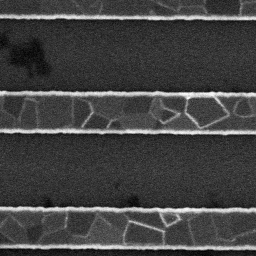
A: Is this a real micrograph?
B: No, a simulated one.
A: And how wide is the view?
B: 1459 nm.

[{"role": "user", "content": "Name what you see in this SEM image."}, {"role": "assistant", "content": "lines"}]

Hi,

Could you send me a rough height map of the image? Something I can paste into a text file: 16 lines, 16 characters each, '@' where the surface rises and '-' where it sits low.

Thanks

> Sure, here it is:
@@@@@@@@@@@@@@@@
----------------
----------------
----------------
----------------
----------------
@@@@@@@@@@@@@@@@
@@@@@@@@@@@@@@@@
----------------
----------------
----------------
----------------
----------------
@@@@@@@@@@@@@@@@
@@@@@@@@@@@@@@@@
--@-@-@@@@@@@@@@